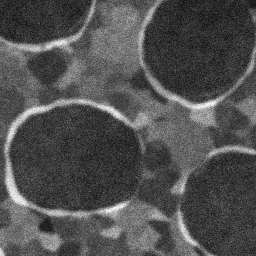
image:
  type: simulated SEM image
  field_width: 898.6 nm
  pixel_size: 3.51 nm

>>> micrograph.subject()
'holes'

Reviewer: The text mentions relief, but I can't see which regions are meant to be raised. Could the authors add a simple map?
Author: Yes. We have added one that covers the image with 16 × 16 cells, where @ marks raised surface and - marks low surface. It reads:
------@@@@------
-----@@@@-------
----@@@@@-------
@@@@@@@@@-------
@@@@@@@@@------@
@@@@@@@@@@-----@
@@@@-@@@@@@@-@@@
@-------@@@@@@@@
@--------@@@@@@@
@--------@@@@@--
@--------@@@----
@--------@@-----
@-------@@@-----
@@@@@@@@@@@-----
@@@@@@@@@@@@----
@@@@@@@@@@@@@---